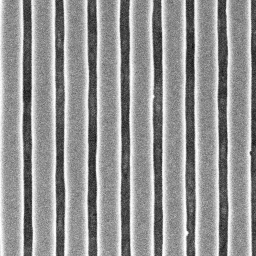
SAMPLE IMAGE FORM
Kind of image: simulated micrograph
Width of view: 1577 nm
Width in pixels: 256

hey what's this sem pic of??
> parallel lines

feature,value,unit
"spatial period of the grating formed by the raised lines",32.6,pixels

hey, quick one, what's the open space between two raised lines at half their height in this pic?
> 57.8 nm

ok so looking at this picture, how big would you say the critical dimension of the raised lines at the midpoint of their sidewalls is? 144 nanometers